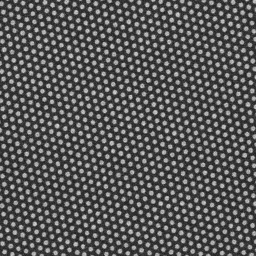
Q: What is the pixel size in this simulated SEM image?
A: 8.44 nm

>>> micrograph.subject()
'a regular array of raised bodies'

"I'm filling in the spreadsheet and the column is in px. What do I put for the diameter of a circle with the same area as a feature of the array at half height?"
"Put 4.22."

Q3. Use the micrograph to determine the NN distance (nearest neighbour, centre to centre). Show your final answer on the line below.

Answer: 0.0667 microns